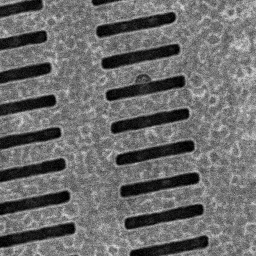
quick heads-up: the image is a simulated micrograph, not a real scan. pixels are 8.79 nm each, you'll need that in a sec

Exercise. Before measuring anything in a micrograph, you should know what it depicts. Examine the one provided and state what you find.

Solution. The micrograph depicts holes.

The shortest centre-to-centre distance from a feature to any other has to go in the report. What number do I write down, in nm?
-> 283